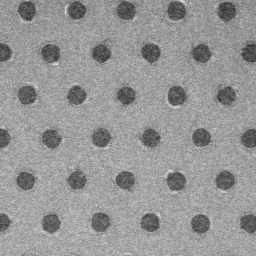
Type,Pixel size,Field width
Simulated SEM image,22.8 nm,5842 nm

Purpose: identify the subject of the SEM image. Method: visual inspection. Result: a regular array of raised bodies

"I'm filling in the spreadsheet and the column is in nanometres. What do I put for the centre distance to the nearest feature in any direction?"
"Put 747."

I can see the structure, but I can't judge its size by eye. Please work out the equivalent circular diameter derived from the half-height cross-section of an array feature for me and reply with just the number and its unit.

459 nm